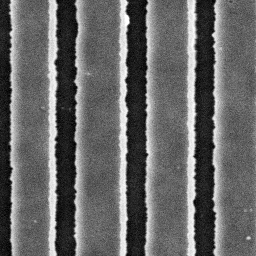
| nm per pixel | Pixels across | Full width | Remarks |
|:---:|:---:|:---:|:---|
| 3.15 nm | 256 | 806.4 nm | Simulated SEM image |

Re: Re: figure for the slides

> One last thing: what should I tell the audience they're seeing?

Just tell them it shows lines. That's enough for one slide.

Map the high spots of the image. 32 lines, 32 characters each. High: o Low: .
.oooooo...oooooo..oooooo...ooooo
.oooooo...oooooo..oooooo...ooooo
.oooooo...oooooo..oooooo...ooooo
..ooooo...oooooo..oooooo...ooooo
.oooooo...oooooo..oooooo...ooooo
.oooooo...oooooo..oooooo...ooooo
.oooooo...oooooo..oooooo...ooooo
.oooooo...oooooo..oooooo...ooooo
..ooooo...oooooo..oooooo...ooooo
.oooooo...oooooo..oooooo...ooooo
.oooooo...oooooo..oooooo...ooooo
..ooooo...oooooo..oooooo...ooooo
.oooooo...oooooo..oooooo...ooooo
.oooooo...oooooo..oooooo...ooooo
.oooooo...oooooo..oooooo...ooooo
.oooooo...oooooo..oooooo...ooooo
.oooooo..ooooooo..oooooo...ooooo
.oooooo..ooooooo..oooooo...ooooo
.oooooo...oooooo..oooooo...ooooo
.oooooo...oooooo..oooooo...ooooo
.oooooo...oooooo..oooooo...ooooo
..ooooo...oooooo..oooooo...ooooo
.oooooo...oooooo..oooooo...ooooo
..ooooo..ooooooo..oooooo...ooooo
.oooooo...oooooo..oooooo...ooooo
..ooooo..ooooooo..oooooo...ooooo
..ooooo...oooooo..oooooo...ooooo
.oooooo...oooooo..oooooo...ooooo
.oooooo..ooooooo..oooooo...ooooo
.oooooo..ooooooo..oooooo...ooooo
.oooooo...oooooo..oooooo...ooooo
..ooooo...oooooo..oooooo...ooooo